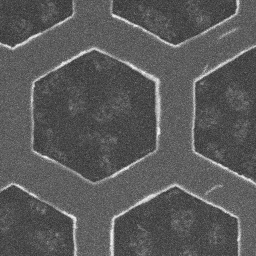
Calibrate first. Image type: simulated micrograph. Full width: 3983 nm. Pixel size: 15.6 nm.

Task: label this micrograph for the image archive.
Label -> holes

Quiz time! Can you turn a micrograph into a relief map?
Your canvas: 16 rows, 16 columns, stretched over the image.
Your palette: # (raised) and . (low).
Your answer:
.....##........#
....####......##
..########..####
#####..########.
###......####...
##........##....
##........##....
##........##....
##........##....
##.......###....
####....######..
################
...######....###
....####......##
.....##........#
.....##........#